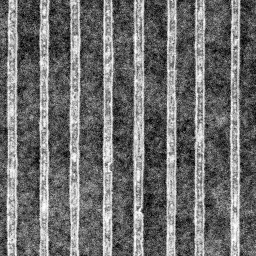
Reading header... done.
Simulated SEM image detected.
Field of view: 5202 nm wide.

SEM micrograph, parallel lines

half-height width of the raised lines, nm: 158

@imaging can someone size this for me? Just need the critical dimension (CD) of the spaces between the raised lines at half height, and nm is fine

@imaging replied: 493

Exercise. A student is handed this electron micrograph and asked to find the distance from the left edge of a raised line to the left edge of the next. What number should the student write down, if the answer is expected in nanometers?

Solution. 647